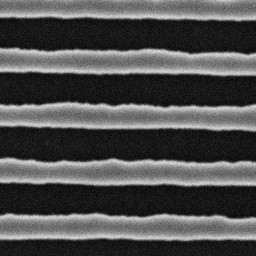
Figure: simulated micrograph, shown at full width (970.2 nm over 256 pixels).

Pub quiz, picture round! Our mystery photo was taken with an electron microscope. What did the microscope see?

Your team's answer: lines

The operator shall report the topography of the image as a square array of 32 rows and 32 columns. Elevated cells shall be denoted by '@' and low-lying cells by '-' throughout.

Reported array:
@@@@@@@@@@@@@@@@@@@@@@@@@@@@@@@@
@@@@@@@@@@@@@@@@@@@@@@@@@@@@@@@@
-----------------------------@--
--------------------------------
--------------------------------
--------------------------------
@@@@@@@@@@@@@@@@@@@@@@----------
@@@@@@@@@@@@@@@@@@@@@@@@@@@@@@@@
@@@@@@@@@@@@@@@@@@@@@@@@@@@@@@@@
--------------------------------
--------------------------------
--------------------------------
--------------------------------
@@@@@@@@@@@@@@@@@@@@@@@@@@@@@@@@
@@@@@@@@@@@@@@@@@@@@@@@@@@@@@@@@
@@@@@@@@@@@@@@@@@@@@@@@@@@@@@@@@
--------------------------------
--------------------------------
--------------------------------
--------------------------------
@@@@@@@@@@@@@@@@@@@@@@@@@@@@@@@@
@@@@@@@@@@@@@@@@@@@@@@@@@@@@@@@@
@@@@@@@@@@@@@@@@@@@@@@@@@@@@@@@@
--------------------------------
--------------------------------
--------------------------------
--------------------------------
@@@@@@@@@@@@@@@@@@@@@@@@@@@@@@@@
@@@@@@@@@@@@@@@@@@@@@@@@@@@@@@@@
@@@@@@@@@@@@@@@@@@@@@@@@@@@@@@@@
--------------------------------
--------------------------------